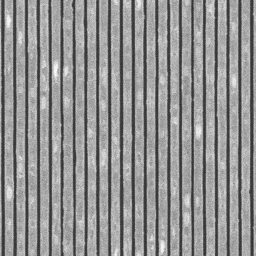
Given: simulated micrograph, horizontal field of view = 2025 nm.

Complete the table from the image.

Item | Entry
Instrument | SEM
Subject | parallel lines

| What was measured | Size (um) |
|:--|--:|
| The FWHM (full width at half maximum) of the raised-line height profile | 0.0712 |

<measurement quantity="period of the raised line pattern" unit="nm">93.7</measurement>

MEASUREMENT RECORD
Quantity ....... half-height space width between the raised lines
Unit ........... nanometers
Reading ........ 28.7